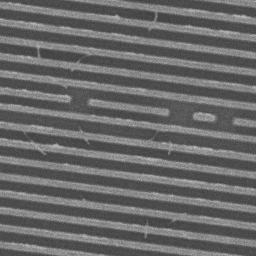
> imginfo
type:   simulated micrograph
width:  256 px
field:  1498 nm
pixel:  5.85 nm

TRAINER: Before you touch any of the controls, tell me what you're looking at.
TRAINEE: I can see parallel lines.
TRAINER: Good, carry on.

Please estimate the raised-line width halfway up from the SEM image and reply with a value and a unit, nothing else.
45 nanometres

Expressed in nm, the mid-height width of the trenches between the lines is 55.1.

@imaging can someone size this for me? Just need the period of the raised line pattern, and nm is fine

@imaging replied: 99.3